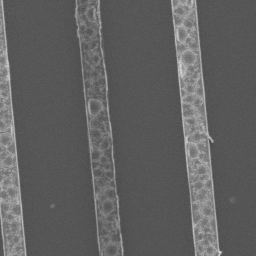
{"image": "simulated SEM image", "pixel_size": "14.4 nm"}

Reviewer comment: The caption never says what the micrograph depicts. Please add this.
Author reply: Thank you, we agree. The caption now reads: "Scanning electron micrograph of one or a few lines or trenches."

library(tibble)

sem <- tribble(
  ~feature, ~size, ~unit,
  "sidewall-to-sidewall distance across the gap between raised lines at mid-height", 73.3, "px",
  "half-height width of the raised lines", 0.336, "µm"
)